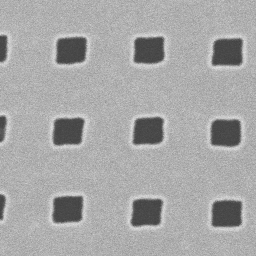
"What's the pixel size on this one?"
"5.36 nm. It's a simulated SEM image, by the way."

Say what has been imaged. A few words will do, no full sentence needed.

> a regular array of holes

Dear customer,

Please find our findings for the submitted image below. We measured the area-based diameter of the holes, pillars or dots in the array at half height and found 171 nanometres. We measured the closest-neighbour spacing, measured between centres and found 419 nanometers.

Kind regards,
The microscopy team